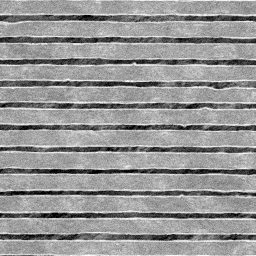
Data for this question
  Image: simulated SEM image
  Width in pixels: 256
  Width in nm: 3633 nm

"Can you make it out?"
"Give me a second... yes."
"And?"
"parallel lines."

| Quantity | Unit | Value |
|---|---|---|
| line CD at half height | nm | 218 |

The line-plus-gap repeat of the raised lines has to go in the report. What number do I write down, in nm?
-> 310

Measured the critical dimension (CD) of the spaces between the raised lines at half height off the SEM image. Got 0.0816 µm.